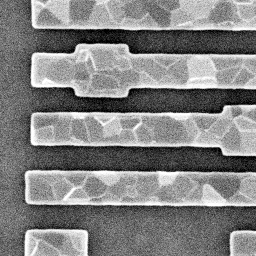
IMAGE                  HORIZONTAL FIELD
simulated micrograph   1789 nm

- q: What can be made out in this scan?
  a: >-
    wiring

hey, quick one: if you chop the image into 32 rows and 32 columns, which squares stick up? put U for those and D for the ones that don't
DDDDUUUUUUUUUUUUUUUUUUUUUUUUUUUU
DDDDUUUUUUUUUUUUUUUUUUUUUUUUUUUU
DDDDUUUUUUUUUUUUUUUUUUUUUUUUUUUU
DDDDDUUUUUUUUUUUUUUUUUUUUUUUUUUU
DDDDDDDDDDDDDDDDDDDDDDDDDDDDDDDD
DDDDDDDDDDDDDDDDDDDDDDDDDDDDDDDD
DDDDDDDDDUUUUUUUDDDDDDDDDDDDDDDD
DDDDUUUUUUUUUUUUUUUUUUUUUUUUUUUU
DDDDUUUUUUUUUUUUUUUUUUUUUUUUUUUU
DDDDUUUUUUUUUUUUUUUUUUUUUUUUUUUU
DDDDUUUUUUUUUUUUUUUUUUUUUUUUUUUU
DDDDDDDDDUUUUUUUDDDDDDDDDDDDDDDD
DDDDDDDDDDDDDDDDDDDDDDDDDDDDDDDD
DDDDDDDDDDDDDDDDDDDDDDDDDDDDUUUU
DDDDUUUUUUUUUUUUUUUUUUUUUUUUUUUU
DDDDUUUUUUUUUUUUUUUUUUUUUUUUUUUU
DDDDUUUUUUUUUUUUUUUUUUUUUUUUUUUU
DDDDUUUUUUUUUUUUUUUUUUUUUUUUUUUU
DDDDDDDDDDDDDDDDDDDDDDDDDDDUUUUU
DDDDDDDDDDDDDDDDDDDDDDDDDDDDDDDD
DDDDDDDDDDDDDDDDDDDDDDDDDDDDDDDD
DDDDUUUUUUUUUUUUUUDUUDDDDDDDDDDD
DDDUUUUUUUUUUUUUUUUUUUUUUUUUUUUU
DDDUUUUUUUUUUUUUUUUUUUUUUUUUUUUU
DDDUUUUUUUUUUUUUUUUUUUUUUUUUUUUU
DDDDDDDDDDDUUUUUUUUUUUUUUUUUUUUU
DDDDDDDDDDDDDDDDDDDDDDDDDDDDDDDD
DDDDDDDDDDDDDDDDDDDDDDDDDDDDDDDD
DDDDDDDDDDDDDDDDDDDDDDDDDDDDDDDD
DDDUUUUUUUUDDDDDDDDDDDDDDDDDDUUU
DDDUUUUUUUUDDDDDDDDDDDDDDDDDDUUU
DDDUUUUUUUUDDDDDDDDDDDDDDDDDDUUU